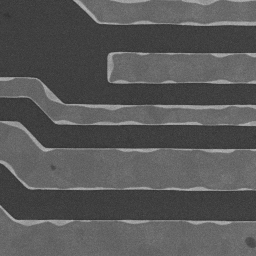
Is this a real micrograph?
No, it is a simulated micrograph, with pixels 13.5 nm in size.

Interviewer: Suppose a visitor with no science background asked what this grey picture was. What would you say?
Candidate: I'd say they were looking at groups of lines, slits or small figures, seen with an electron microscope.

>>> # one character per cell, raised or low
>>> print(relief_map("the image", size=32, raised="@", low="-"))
----------@@@@@@@@@@@@@@@@@@@@@@
-----------@@@@@@@@@@@@@@@@@@@@@
------------@@@@@@@@@@@@@@@@@@@@
--------------------------------
--------------------------------
--------------------------------
--------------------------------
--------------@@@@@@@@@@@@@@@@@@
--------------@@@@@@@@@@@@@@@@@@
--------------@@@@@@@@@@@@@@@@@@
@@@@@---------------------------
@@@@@@--------------------------
----@@@-------------------------
-----@@@@@@@@@@@@@@@@@@@@@@@@@@@
------@@@@@@@@@@@@@@@@@@@@@@@@@@
@@-------@@@-----@@@@----@@@@@@-
@@@-----------------------------
@@@@----------------------------
@@@@@---------------------------
@@@@@@@@@@@@@@@@@@@@@@@@@@@@@@@@
-@@@@@@@@@@@@@@@@@@@@@@@@@@@@@@@
--@@@@@@@@@@@@@@@@@@@@@@@@@@@@@@
--@@@@@@@@@@@@@@@@@@@@@@@@@@@@@@
----@@@@@@@@@@@@@@@@@@@@@@@@@@@@
--------------------------------
--------------------------------
@-------------------------------
@@------------------------------
@@@@@@@@@@@@@@@@@@@@@@@@@@@@@@@@
@@@@@@@@@@@@@@@@@@@@@@@@@@@@@@@@
@@@@@@@@@@@@@@@@@@@@@@@@@@@@@@@@
@@@@@@@@@@@@@@@@@@@@@@@@@@@@@@@@